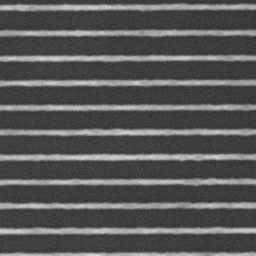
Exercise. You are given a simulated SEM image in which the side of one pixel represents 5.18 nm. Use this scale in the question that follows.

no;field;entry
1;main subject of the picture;parallel lines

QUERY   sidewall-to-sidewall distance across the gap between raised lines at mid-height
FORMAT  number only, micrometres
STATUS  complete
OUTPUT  0.109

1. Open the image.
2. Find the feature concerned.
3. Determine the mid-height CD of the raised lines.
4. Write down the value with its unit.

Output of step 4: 19.4 nanometers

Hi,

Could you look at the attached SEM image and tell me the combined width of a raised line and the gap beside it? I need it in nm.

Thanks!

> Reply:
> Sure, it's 129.